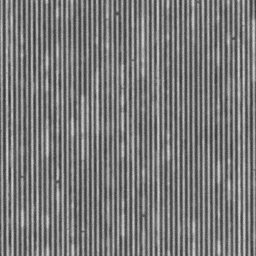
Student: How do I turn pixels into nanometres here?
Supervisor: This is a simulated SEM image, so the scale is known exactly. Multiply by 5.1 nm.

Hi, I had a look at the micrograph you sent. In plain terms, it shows parallel lines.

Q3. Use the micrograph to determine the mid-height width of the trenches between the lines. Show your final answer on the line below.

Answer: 19.1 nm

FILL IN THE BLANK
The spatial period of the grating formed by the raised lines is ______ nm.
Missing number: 25.7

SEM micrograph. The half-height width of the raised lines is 5.1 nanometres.